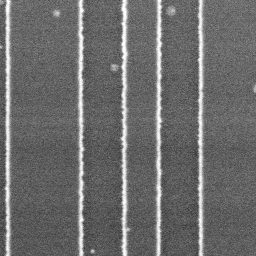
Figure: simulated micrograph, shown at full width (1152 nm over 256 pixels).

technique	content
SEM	lines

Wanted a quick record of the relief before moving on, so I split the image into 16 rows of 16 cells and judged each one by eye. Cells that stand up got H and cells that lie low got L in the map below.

HHHHHLLLHHLLHHHH
HHHHHLLLHHLLHHHH
HHHHHLLLHHLLLHHH
HHHHHLLLHHLLHHHH
HHHHHLLLHHLLLHHH
HHHHHLLLHHLLLHHH
HHHHHLLLHHLLHHHH
HHHHHLLLHHLLHHHH
HHHHHLLLHHLLHHHH
HHHHHLLLHHLLHHHH
HHHHHLLLHHLLLHHH
HHHHHLLLHHLLHHHH
HHHHHLLLHHLLHHHH
HHHHHLLLHHLLLHHH
HHHHHLLLHHLLLHHH
HHHHHLLLHHLLLHHH